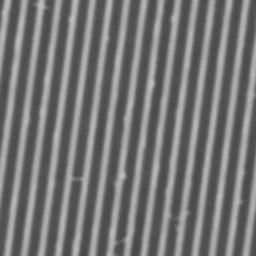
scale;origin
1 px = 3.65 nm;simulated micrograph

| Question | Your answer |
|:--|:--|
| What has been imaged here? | parallel lines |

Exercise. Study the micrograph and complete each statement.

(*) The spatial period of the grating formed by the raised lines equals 61.7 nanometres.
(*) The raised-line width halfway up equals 22.1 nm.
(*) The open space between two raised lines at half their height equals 10.6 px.